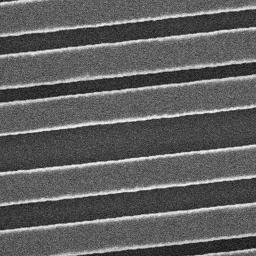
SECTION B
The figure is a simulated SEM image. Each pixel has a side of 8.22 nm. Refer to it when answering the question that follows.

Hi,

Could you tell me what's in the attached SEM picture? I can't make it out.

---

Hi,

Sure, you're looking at lines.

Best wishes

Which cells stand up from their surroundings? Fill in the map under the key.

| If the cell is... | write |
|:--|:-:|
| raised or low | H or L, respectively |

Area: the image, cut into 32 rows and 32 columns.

HHHHHHHHHHHHHHHHHHHHHHHHHHHHHHHH
HHHHHHHHHHHHHHHHHHHHHHHHHHHLLLLL
HHHHHHHHHHHHHHHHHHHLLLLLLLLLLLLL
HHHHHHHHHHLLLLLLLLLLLLLLLLLLLLLH
HLLLLLLLLLLLLLLLLLLLLLLHHHHHHHHH
LLLLLLLLLLLLLHHHHHHHHHHHHHHHHHHH
LLLLLHHHHHHHHHHHHHHHHHHHHHHHHHHH
HHHHHHHHHHHHHHHHHHHHHHHHHHHHHHHH
HHHHHHHHHHHHHHHHHHHHHHHHHLLLLLLL
HHHHHHHHHHHHHHHLLLLLLLLLLLLLLLLH
HHHHHHHLLLLLLLLLLLLLLLHHHHHHHHHH
LLLLLLLLLLLLLHHHHHHHHHHHHHHHHHHH
LLLLLHHHHHHHHHHHHHHHHHHHHHHHHHHH
HHHHHHHHHHHHHHHHHHHHHHHHHHHHHHHL
HHHHHHHHHHHHHHHHHHHHHHHLLLLLLLLL
HHHHHHHHHHHHLLLLLLLLLLLLLLLLLLLL
HHHHLLLLLLLLLLLLLLLLLLLLLLLLLLLL
LLLLLLLLLLLLLLLLLLLLLLLLLLLLLLLL
LLLLLLLLLLLLLLLLLLLLLLLLLLLLLHHH
LLLLLLLLLLLLLLLLLLLLHHHHHHHHHHHH
LLLLLLLLLLLHHHHHHHHHHHHHHHHHHHHH
LHHHHHHHHHHHHHHHHHHHHHHHHHHHHHHH
HHHHHHHHHHHHHHHHHHHHHHHHHHHHHLLL
HHHHHHHHHHHHHHHHHHHLLLLLLLLLLLLL
HHHHHHHHHHHLLLLLLLLLLLLLLLLLLLLL
HHLLLLLLLLLLLLLLLLLLLLLLLLLLLLLH
LLLLLLLLLLLLLLLLLLLLLLLHHHHHHHHH
LLLLLLLLLLLLLHHHHHHHHHHHHHHHHHHH
LLLLHHHHHHHHHHHHHHHHHHHHHHHHHHHH
HHHHHHHHHHHHHHHHHHHHHHHHHHHHHHHL
HHHHHHHHHHHHHHHHHHHHHHHLLLLLLLLL
HHHHHHHHHHHHHLLLLLLLLLLLLLLLHHHH